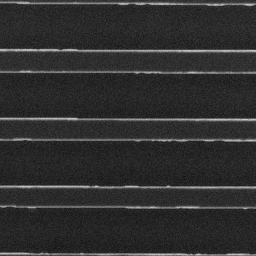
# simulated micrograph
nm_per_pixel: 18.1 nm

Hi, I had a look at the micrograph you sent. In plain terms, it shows lines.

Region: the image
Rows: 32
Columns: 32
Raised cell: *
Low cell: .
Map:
..............**.***************
................................
................................
................................
................................
................................
********************************
********************************
********************************
................................
................................
................................
................................
................................
................................
********************************
********************************
.................*.*****.**.****
................................
................................
................................
................................
................................
********************************
********************************
********************************
................................
................................
................................
................................
................................
................................